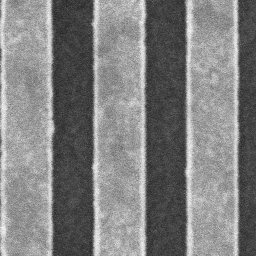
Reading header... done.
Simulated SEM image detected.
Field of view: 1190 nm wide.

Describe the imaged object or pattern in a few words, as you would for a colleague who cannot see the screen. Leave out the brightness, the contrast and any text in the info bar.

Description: one or a few lines or trenches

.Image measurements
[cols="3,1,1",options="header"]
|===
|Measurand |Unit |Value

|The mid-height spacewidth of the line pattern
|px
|46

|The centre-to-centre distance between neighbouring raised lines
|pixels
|92.9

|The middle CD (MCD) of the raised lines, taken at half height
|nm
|218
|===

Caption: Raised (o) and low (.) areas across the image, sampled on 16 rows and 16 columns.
ooo...ooo...ooo.
ooo...ooo...ooo.
ooo...ooo...ooo.
ooo...ooo...ooo.
ooo...ooo...ooo.
ooo...ooo...ooo.
ooo...ooo...ooo.
ooo...ooo...ooo.
ooo...ooo...ooo.
ooo...ooo...ooo.
ooo...ooo...ooo.
ooo...ooo...ooo.
ooo...ooo...ooo.
ooo...ooo...ooo.
ooo...ooo...ooo.
ooo...ooo...ooo.